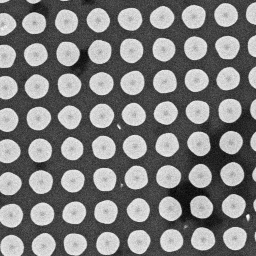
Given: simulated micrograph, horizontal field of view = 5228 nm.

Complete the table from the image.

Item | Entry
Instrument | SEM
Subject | an array of small figures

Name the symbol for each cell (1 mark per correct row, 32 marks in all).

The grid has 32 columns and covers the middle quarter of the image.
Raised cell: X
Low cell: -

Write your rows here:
--------------------------------
--------------------------------
--------XXX-----XXX----XXXX----X
XXX----XXXXX---XXXXX---XXXXX--XX
XXXX---XXXXX--XXXXXX--XXXXXX--XX
XXXX---XXXXX--XXXXXX---XXXXX---X
XXXX---XXXXX---XXXX----XXXXX----
XXX-----XX------XX--------------
--------------------------------
-------------------------X------
--------XXX-----XXX----XXXXX---X
XXXX---XXXXX---XXXXX---XXXXX---X
XXXX---XXXXX---XXXXX---XXXXX---X
XXXX---XXXXX---XXXXX---XXXXX---X
XXXX---XXXXX---XXXXX----XXX-----
XXX-----XXX---------------------
--------------------------------
-------------------------XX-----
-X------XXX-----XXX-----XXXX---X
XXXX---XXXXX---XXXXX---XXXXX---X
XXXXX--XXXXXX--XXXXXX--XXXXXX--X
XXXXX--XXXXXX--XXXXXX--XXXXX----
XXXXX---XXXX----XXXX----XXX-----
-XXX-----XX------XX-------------
--------------------------------
-------------------------XX-----
--------XXXX----XXXX----XXXX----
XXXXX---XXXXX--XXXXXX--XXXXXX--X
XXXXX--XXXXXX--XXXXXX--XXXXXX--X
XXXXX---XXXXX--XXXXXX--XXXXXX---
XXXXX---XXXXX---XXXX-----XXX----
-XXX-----XXX--------------------